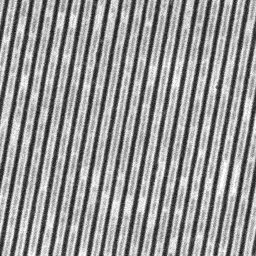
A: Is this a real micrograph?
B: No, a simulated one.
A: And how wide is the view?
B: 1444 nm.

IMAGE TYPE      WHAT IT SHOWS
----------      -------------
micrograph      parallel lines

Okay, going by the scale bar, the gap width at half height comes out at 33.4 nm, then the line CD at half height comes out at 33.4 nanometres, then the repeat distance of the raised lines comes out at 70.5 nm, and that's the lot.